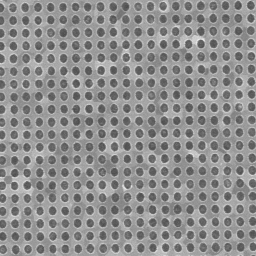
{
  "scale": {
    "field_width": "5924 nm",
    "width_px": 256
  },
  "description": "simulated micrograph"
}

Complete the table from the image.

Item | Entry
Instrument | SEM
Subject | a regular array of holes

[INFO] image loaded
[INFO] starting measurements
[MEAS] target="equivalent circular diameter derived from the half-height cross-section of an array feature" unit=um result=0.204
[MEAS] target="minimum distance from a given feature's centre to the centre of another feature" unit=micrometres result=0.285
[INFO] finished